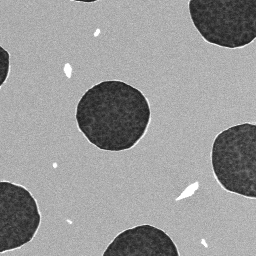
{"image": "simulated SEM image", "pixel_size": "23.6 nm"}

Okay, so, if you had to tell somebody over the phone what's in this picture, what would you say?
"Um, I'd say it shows holes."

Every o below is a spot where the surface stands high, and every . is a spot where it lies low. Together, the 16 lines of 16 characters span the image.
oooooooooooo....
oooooooooooo....
ooooooooooooo...
.ooooooooooooooo
oooooooooooooooo
oooooo..oooooooo
ooooo....ooooooo
ooooo....ooooooo
ooooo....ooooo..
ooooooooooooo...
ooooooooooooo...
.ooooooooooooo..
..oooooooooooooo
..oooooooooooooo
..oooooo..oooooo
.oooooo....ooooo